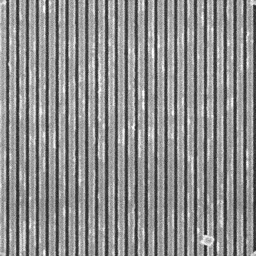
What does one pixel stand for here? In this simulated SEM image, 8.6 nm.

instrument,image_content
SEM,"parallel lines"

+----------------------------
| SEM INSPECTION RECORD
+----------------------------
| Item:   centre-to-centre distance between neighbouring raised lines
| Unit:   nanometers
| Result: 84.9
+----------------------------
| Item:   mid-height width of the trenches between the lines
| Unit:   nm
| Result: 32.2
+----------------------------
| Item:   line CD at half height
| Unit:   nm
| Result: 57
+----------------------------